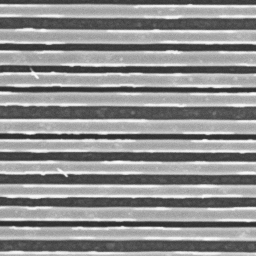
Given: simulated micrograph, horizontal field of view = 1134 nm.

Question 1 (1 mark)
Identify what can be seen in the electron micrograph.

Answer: parallel lines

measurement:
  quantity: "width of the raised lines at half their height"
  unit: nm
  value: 61.5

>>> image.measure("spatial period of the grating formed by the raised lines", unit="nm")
98.4